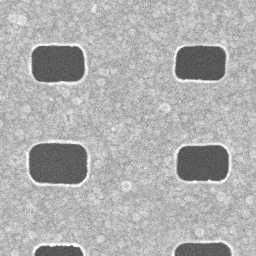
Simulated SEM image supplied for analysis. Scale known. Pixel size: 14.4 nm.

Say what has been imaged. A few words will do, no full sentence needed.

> holes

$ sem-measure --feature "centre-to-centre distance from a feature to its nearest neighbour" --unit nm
1440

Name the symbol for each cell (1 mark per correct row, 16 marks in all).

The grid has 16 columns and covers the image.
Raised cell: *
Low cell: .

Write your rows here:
****************
****************
****************
**...******...**
**...******...**
****************
****************
****************
****************
**...******...**
**...******...**
****.***********
****************
****************
****************
***..******...**